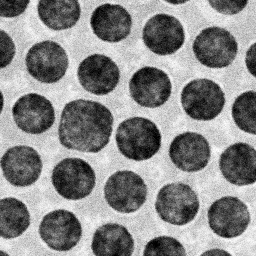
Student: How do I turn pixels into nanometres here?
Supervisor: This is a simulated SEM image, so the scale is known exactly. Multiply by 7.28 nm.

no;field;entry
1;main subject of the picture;a regular array of holes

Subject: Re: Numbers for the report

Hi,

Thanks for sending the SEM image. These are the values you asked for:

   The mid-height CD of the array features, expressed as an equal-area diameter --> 313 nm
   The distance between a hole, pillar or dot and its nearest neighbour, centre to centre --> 387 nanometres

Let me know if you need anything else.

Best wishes